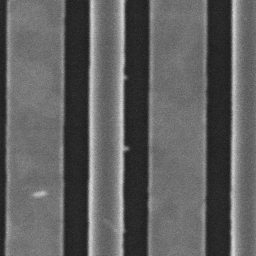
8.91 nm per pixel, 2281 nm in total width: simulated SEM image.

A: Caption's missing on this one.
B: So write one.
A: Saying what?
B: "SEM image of lines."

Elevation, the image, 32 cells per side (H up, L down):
LHHHHHHHLLLHHHHLLLLHHHHHHHLLLHHH
LHHHHHHHLLLHHHHLLLLHHHHHHHLLLHHH
LHHHHHHHLLLHHHHLLLLHHHHHHHLLLHHH
LHHHHHHHLLLHHHHLLLLHHHHHHHLLLHHH
LHHHHHHHLLLHHHHLLLLHHHHHHHLLLHHH
LHHHHHHHLLLHHHHLLLLHHHHHHHLLLHHH
LHHHHHHHLLLHHHHLLLLHHHHHHHLLLHHH
LHHHHHHHLLLHHHHLLLLHHHHHHHLLLHHH
LHHHHHHHLLLHHHHLLLLHHHHHHHLLLHHH
LHHHHHHHLLLHHHHLLLLHHHHHHHLLLHHH
LHHHHHHHLLLHHHHLLLLHHHHHHHLLLHHH
LHHHHHHHLLLHHHHLLLLHHHHHHHLLLHHH
LHHHHHHHLLLHHHHLLLLHHHHHHHLLLHHH
LHHHHHHHLLLHHHHLLLLHHHHHHHLLLHHH
LHHHHHHHLLLHHHHLLLLHHHHHHHLLLHHH
LHHHHHHHLLLHHHHLLLLHHHHHHHLLLHHH
LHHHHHHHLLLHHHHLLLLHHHHHHHLLLHHH
LHHHHHHHLLLHHHHLLLLHHHHHHHLLLHHH
LHHHHHHHLLLHHHHLLLLHHHHHHHLLLHHH
LHHHHHHHLLLHHHHLLLLHHHHHHHLLLHHH
LHHHHHHHLLLHHHHLLLLHHHHHHHLLLHHH
LHHHHHHHLLLHHHHLLLLHHHHHHHLLLHHH
LHHHHHHHLLLHHHHLLLLHHHHHHHLLLHHH
LHHHHHHHLLLHHHHLLLLHHHHHHHLLLHHH
LHHHHHHHLLLHHHHLLLLHHHHHHHLLLHHH
LHHHHHHHLLLHHHHLLLLHHHHHHHLLLHHH
LHHHHHHHLLLHHHHLLLLHHHHHHHLLLHHH
LHHHHHHHLLLHHHHLLLLHHHHHHHLLLHHH
LHHHHHHHLLLHHHHLLLLHHHHHHHLLLHHH
LHHHHHHHLLLHHHHLLLLHHHHHHHLLLHHH
LHHHHHHHLLLHHHHLLLLHHHHHHHLLLHHH
LHHHHHHHLLLHHHHLLLLHHHHHHHLLLHHH